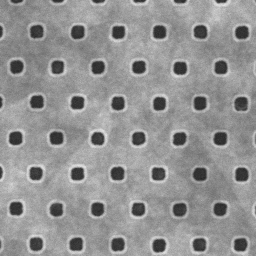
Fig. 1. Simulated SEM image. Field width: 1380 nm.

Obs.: a regular array of holes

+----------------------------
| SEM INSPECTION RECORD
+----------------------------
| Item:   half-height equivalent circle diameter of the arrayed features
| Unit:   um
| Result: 0.0872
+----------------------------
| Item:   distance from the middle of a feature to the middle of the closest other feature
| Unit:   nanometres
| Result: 218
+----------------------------